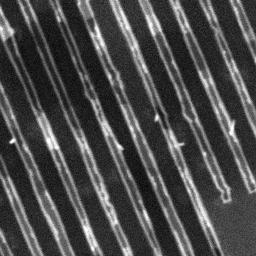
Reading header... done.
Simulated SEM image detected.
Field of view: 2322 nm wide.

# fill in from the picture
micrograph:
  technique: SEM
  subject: parallel lines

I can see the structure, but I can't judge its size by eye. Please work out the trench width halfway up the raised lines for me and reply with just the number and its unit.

181 nanometres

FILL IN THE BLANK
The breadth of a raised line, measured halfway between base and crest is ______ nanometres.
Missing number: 70.1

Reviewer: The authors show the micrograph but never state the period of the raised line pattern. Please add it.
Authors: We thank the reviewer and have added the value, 28 px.